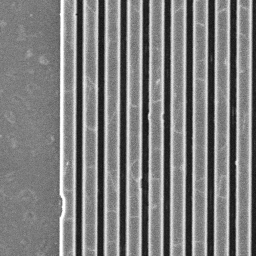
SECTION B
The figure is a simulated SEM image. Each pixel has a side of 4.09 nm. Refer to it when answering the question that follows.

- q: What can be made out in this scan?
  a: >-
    parallel lines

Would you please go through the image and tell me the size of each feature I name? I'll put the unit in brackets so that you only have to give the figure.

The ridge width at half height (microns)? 0.0583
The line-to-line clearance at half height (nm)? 30.7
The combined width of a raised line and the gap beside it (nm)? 89.7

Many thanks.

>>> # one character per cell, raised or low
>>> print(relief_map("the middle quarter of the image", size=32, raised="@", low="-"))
@@@--@@@--@@@@--@@@---@@@--@@@--
@@@--@@@--@@@@--@@@---@@@--@@@--
@@@--@@@--@@@@--@@@---@@@--@@@--
@@@--@@@--@@@@--@@@---@@@--@@@--
@@@--@@@--@@@@--@@@---@@@--@@@--
@@@--@@@--@@@@--@@@---@@@--@@@--
@@@--@@@--@@@@--@@@---@@@--@@@--
@@@--@@@--@@@@--@@@---@@@--@@@--
@@@--@@@--@@@@--@@@---@@@--@@@--
@@@--@@@--@@@@--@@@---@@@--@@@--
@@@--@@@--@@@@--@@@---@@@--@@@--
@@@--@@@--@@@@--@@@--@@@@--@@@--
@@@--@@@--@@@@--@@@--@@@@--@@@--
@@@--@@@--@@@@--@@@--@@@@--@@@--
@@@--@@@--@@@@--@@@--@@@@--@@@--
@@@--@@@--@@@@--@@@--@@@@--@@@--
@@@--@@@--@@@@--@@@--@@@@--@@@--
@@@--@@@--@@@@--@@@--@@@@--@@@--
@@@--@@@--@@@@--@@@--@@@@--@@@--
@@@--@@@--@@@@--@@@--@@@@--@@@--
@@@--@@@--@@@@--@@@--@@@@--@@@--
@@@--@@@--@@@@--@@@--@@@@--@@@--
@@@--@@@--@@@@--@@@--@@@@--@@@--
@@@--@@@--@@@@--@@@--@@@@--@@@--
@@@--@@@--@@@@--@@@--@@@@--@@@--
@@@--@@@--@@@@--@@@--@@@@--@@@--
@@@--@@@--@@@@--@@@--@@@@--@@@--
@@@--@@@--@@@@--@@@--@@@@--@@@--
@@@--@@@--@@@@--@@@--@@@@--@@@--
@@@--@@@--@@@@--@@@--@@@@--@@@--
@@@--@@@--@@@@--@@@--@@@@--@@@--
@@@--@@@--@@@@--@@@--@@@@--@@@--